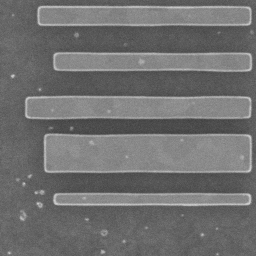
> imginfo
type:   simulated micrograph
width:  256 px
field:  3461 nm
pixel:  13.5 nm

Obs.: groups of lines, slits or small figures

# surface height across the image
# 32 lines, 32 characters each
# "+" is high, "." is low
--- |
................................
.....++++++++++++++++++++++++++.
.....++++++++++++++++++++++++++.
................................
................................
................................
................................
.......++++++++++++++++++++++++.
.......++++++++++++++++++++++++.
................................
................................
................................
...++++++++++++++++++++++++++++.
...++++++++++++++++++++++++++++.
....+++++++++++++++++++++++++++.
................................
................................
......+++++++++++++++++++++++++.
......+++++++++++++++++++++++++.
......+++++++++++++++++++++++++.
......+++++++++++++++++++++++++.
................................
................................
................................
.......++++++++++++++++++++++++.
.......++++++++++++++++++++++++.
................................
................................
................................
................................
................................
................................